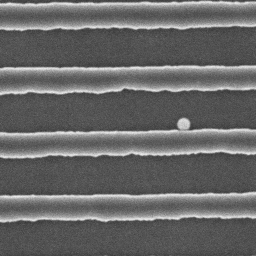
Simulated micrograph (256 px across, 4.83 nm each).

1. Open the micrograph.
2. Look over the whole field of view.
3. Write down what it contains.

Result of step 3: lines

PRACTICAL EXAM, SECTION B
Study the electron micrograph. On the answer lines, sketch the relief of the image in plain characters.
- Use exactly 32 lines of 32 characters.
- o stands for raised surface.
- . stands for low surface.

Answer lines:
.o....ooo.oooooooooooooooooooooo
oooooooooooooooooooooooooooooooo
oooooooooooooooooooooooooooooooo
ooooooo.oo.......oo...o.........
................................
................................
................................
................................
................oooooooooooooooo
oooooooooooooooooooooooooooooooo
oooooooooooooooooooooooooooooooo
ooo.ooooo..oo...................
................................
................................
................................
......................oo........
..................oooooooooooooo
oooooooooooooooooooooooooooooooo
oooooooooooooooooooooooooooooooo
ooooo...........................
................................
................................
................................
................................
.........o.ooooo..oooooooooooooo
oooooooooooooooooooooooooooooooo
oooooooooooooooooooooooooooooooo
oo.o.........o..................
................................
................................
................................
................................